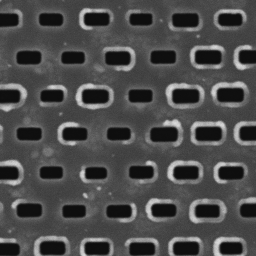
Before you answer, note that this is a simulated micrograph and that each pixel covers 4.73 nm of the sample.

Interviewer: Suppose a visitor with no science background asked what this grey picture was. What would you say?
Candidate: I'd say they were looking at a regular array of holes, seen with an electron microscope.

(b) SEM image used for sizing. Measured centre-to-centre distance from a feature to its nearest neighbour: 206 nanometers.